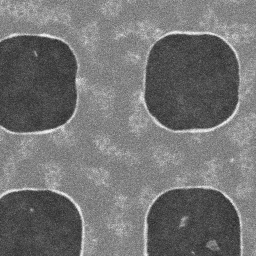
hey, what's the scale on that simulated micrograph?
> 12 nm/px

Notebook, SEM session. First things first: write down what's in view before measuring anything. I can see holes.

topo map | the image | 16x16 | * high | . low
****************
****************
....******....**
.....****......*
.....****......*
.....****......*
.....****......*
....******....**
****************
****************
****************
****************
....******....**
.....****......*
.....****......*
.....****......*